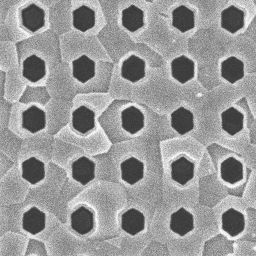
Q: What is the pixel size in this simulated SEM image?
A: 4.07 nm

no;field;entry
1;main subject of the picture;a regular array of holes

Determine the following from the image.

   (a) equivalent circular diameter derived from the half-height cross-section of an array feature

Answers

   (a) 100 nm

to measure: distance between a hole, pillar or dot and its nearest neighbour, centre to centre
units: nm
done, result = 200